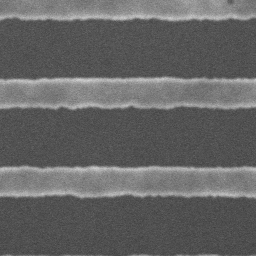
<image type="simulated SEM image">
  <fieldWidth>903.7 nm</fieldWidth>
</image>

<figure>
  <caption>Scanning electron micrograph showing lines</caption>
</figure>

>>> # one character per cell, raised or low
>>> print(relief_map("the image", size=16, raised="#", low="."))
################
................
................
................
................
################
################
................
................
................
################
################
................
................
................
................